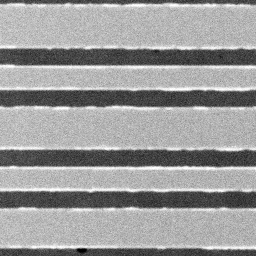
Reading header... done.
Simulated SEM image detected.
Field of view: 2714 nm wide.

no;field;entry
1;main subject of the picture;lines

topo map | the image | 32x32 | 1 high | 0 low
00000000000000000000000000000000
11111111111111111111111111111111
11111111111111111111111111111111
11111111111111111111111111111111
11111111111111111111111111111111
11111111111111111111111111111111
00000000000000000000000000000000
00000000000000000000000000000000
11111111111111111111111111111111
11111111111111111111111111111111
11111111111111111111111111111111
00000000000000000000000000000000
00000000000000000000000000000000
00111100000101111000000000000000
11111111111111111111111111111111
11111111111111111111111111111111
11111111111111111111111111111111
11111111111111111111111111111111
11111111111111111111111111111111
00000000000000000000000000000000
00000000000000000000000000000000
11111111111111111111111111111111
11111111111111111111111111111111
11111111111111111111111111111111
00000000000000000000000000000000
00000000000000000000000000000000
11111111111111111111111111111111
11111111111111111111111111111111
11111111111111111111111111111111
11111111111111111111111111111111
11111111111111111111111111111111
00000000000000000000000000000000